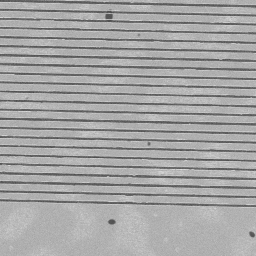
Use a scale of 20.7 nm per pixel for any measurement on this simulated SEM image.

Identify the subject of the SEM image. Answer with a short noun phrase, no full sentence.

parallel lines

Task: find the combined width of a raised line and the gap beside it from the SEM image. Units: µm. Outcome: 0.188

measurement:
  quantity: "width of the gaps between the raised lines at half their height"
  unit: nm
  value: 51.7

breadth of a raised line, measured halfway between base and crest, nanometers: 134